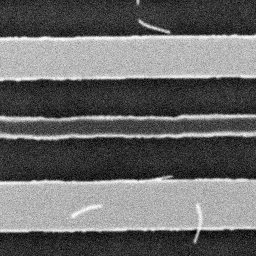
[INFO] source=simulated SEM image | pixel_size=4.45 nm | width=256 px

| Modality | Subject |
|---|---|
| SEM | lines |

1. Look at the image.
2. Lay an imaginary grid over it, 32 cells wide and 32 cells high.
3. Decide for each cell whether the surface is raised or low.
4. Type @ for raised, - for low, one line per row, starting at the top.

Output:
--------------------------------
--------------------------------
--------------------------------
--------------------------------
-----------------------------@--
@@@@@@@@@@@@@@@@@@@@@@@@@@@@@@@@
@@@@@@@@@@@@@@@@@@@@@@@@@@@@@@@@
@@@@@@@@@@@@@@@@@@@@@@@@@@@@@@@@
@@@@@@@@@@@@@@@@@@@@@@@@@@@@@@@@
@@@@@@@@@@@@@@@@@@@@@@@@@@@@@@@@
--------------------------------
--------------------------------
--------------------------------
--------------------------------
-----------------------------@@@
@@@@@@@@@@@@@@@@@@@@@@@@@@@@@@@@
@@@@@@@@@@@@@@@@@@@@@@@@@@@@@@@@
--------------------------------
--------------------------------
--------------------------------
--------------------------------
--------------------------------
-------------------@----@@@@@@@-
@@@@@@@@@@@@@@@@@@@@@@@@@@@@@@@@
@@@@@@@@@@@@@@@@@@@@@@@@@@@@@@@@
@@@@@@@@@@@@@@@@@@@@@@@@@@@@@@@@
@@@@@@@@@@@@@@@@@@@@@@@@@@@@@@@@
@@@@@@@@@@@@@@@@@@@@@@@@@@@@@@@@
@@@@@@@@@@@@@@@@@@@@@@@@@@@@@@@@
--------------------------------
--------------------------------
--------------------------------